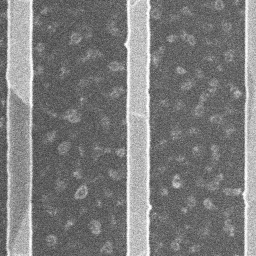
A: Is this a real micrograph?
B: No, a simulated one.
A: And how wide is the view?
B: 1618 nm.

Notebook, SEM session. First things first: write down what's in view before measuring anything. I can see one or a few lines or trenches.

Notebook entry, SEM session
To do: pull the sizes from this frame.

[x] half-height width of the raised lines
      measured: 138 nm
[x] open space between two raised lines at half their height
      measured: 96.9 pixels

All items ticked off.